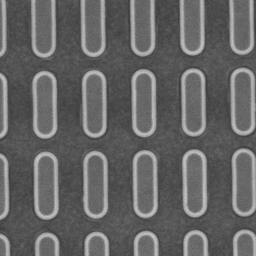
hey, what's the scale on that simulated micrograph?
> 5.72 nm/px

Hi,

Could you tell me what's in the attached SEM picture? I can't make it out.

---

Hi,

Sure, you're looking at groups of lines, slits or small figures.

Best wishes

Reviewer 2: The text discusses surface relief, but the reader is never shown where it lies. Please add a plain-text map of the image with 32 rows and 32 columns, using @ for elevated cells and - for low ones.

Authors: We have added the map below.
@---@@@---@@@----@@----@@----@@-
@---@@@---@@@----@@----@@----@@-
@---@@@---@@@----@@----@@----@@-
@---@@@---@@@----@@----@@----@@-
@---@@@---@@@----@@----@@----@@-
@---@@@---@@@----@@----@@----@@-
----@@-----@@----@@----@@-----@-
--------------------------------
--------------------------------
-----@-----@@----@@----@@----@@-
@---@@@----@@----@@----@@----@@@
@---@@@----@@----@@----@@----@@@
@---@@@----@@----@@----@@----@@@
@---@@@----@@----@@----@@----@@@
@---@@@----@@----@@----@@----@@@
@---@@@----@@----@@----@@----@@@
@----@@----@@----@@----@@-----@-
--------------------------------
--------------------------------
-----@-----@@----@@----@@----@@@
@---@@@----@@----@@----@@@---@@@
@---@@@----@@----@@----@@@---@@@
@---@@@----@@----@@----@@@---@@@
@---@@@----@@----@@----@@@---@@@
@---@@@----@@----@@----@@@---@@@
@---@@@----@@----@@----@@@---@@@
@----@@----@@----@@----@@-----@-
--------------------------------
--------------------------------
-----@@----@@----@@----@@-----@@
@----@@----@@----@@@---@@@---@@@
@----@@----@@----@@@---@@@---@@@